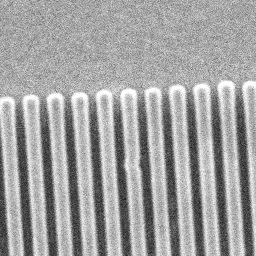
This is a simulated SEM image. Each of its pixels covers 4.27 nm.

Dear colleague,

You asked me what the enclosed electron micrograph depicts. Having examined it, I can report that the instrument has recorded parallel lines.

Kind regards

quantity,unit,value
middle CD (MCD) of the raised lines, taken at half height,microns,0.0612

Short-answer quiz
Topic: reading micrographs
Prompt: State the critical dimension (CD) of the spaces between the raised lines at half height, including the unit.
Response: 0.0431 µm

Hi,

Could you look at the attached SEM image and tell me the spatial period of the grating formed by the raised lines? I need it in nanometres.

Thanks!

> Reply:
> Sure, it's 104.